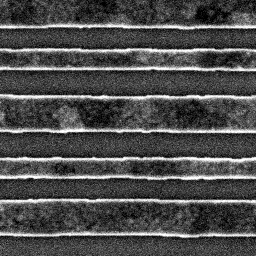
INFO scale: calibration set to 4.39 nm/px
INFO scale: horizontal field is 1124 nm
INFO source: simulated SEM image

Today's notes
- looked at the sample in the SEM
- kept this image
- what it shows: lines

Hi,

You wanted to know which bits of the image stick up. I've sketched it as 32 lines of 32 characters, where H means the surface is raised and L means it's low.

HHHHHHHHHHHHHHHHHHHHHHHHHHHHHHHH
HHHHHHHHHHHHHHHHHHHHHHHHHHHHHHHH
HHHHHHHHHHHHHHHHHHHHHHHHHHHHHHHH
LLLLLLLLLLLLLLLLLLLLLLLHLLLLLLLL
LLLLLLLLLLLLLLLLLLLLLLLLLLLLLLLL
LLLLLLLLLLLLLLLLLLLLLLLLLLLLLLLL
HHHHHHHHHHHHHHHHHHHHHHHHHHHHHHHH
HHHHHHHHHHHHHHHHHHHHHHHHHHHHHHHH
HHHHHHHHHHHHHHHHHHHHHHHHHHHHHHHH
LLLLLLLLLLLLLLLLLLLLLLLLLLLLLLLL
LLLLLLLLLLLLLLLLLLLLLLLLLLLLLLLL
LLLLLLLLLLLLLLLLLLLLLLLLLLLLLLLL
HHHHHHHHHHHHHHHHHHHHHHHHHHHHHHHH
HHHHHHHHHHHHHHHHHHHHHHHHHHHHHHHH
HHHHHHHHHHHHHHHHHHHHHHHHHHHHHHHH
HHHHHHHHHHHHHHHHHHHHHHHHHHHHHHHH
LHHLLLHHHLLLLLLLLHHLLHHHHHHHHHHH
LLLLLLLLLLLLLLLLLLLLLLLLLLLLLLLL
LLLLLLLLLLLLLLLLLLLLLLLLLLLLLLLL
LLLLLLLLLLLLLLLLLLLLLLLLLLLLLLLL
HHHHHHHHHHHHHHHHHHHHHHHHHHHHHHHH
HHHHHHHHHHHHHHHHHHHHHHHHHHHHHHHH
LLLLLLLLLLLLLLLLLLLLLLLLLLLLLLLL
LLLLLLLLLLLLLLLLLLLLLLLLLLLLLLLL
LLLLLLLLLLLLLLLLLLLLLLLLLLLLLLLL
HHHHHHHHHHHHHHHHHHHHHHHHHHHHHHHH
HHHHHHHHHHHHHHHHHHHHHHHHHHHHHHHH
HHHHHHHHHHHHHHHHHHHHHHHHHHHHHHHH
HHHHHHHHHHHHHHHHHHHHHHHHHHHHHHHH
LLLLLLLLLLLLLLLLLLLLLLHHHLLLLLLL
LLLLLLLLLLLLLLLLLLLLLLLLLLLLLLLL
LLLLLLLLLLLLLLLLLLLLLLLLLLLLLLLL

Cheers